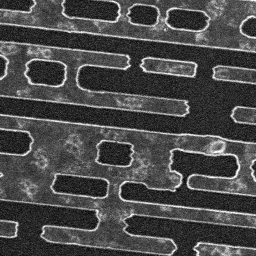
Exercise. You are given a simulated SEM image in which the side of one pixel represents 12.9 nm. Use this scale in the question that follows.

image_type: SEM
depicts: parallel lines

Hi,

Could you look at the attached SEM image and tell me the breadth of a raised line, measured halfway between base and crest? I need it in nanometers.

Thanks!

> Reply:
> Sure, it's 183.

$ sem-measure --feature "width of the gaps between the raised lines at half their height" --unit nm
260